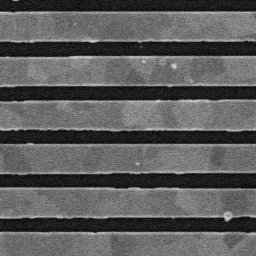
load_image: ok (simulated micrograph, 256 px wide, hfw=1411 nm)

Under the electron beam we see lines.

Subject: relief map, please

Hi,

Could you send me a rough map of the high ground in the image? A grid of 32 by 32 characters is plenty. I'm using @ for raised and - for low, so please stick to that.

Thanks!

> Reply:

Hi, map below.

--------------------------------
--------------------------------
@@@@@@@@@@@@@@@@@@@@@@@@@@@@@@@@
@@@@@@@@@@@@@@@@@@@@@@@@@@@@@@@@
@@@@@@@@@@@@@@@@@@@@@@@@@@@@@@@@
--------------------------------
--------------------------------
@@@@@@@@@@@@@@@@@@@@@@@@@@@@@@@@
@@@@@@@@@@@@@@@@@@@@@@@@@@@@@@@@
@@@@@@@@@@@@@@@@@@@@@@@@@@@@@@@@
@@@@@@@@@@@@@@@@@@@@@@@@@@@@@@@@
--------------------------------
--------------------------------
@@@@@@@@@@@@@@@@@@@@@@@@@@@@@@@@
@@@@@@@@@@@@@@@@@@@@@@@@@@@@@@@@
@@@@@@@@@@@@@@@@@@@@@@@@@@@@@@@@
--------------------------------
--------------------------------
@@@@@@@@@@@@@@@@@@@@@@@@@@@@@@@@
@@@@@@@@@@@@@@@@@@@@@@@@@@@@@@@@
@@@@@@@@@@@@@@@@@@@@@@@@@@@@@@@@
@@@@@@@@@@@@@@@@@@@@@@@@@@@@@@@@
--------------------------------
--------------------------------
@@@@@@@@@@@@@@@@@@@@@@@@@@@@@@@@
@@@@@@@@@@@@@@@@@@@@@@@@@@@@@@@@
@@@@@@@@@@@@@@@@@@@@@@@@@@@@@@@@
--------------------------------
--------------------------------
@@@@@@@@@@@@@@@@@@@@@@@@@@@@@@@@
@@@@@@@@@@@@@@@@@@@@@@@@@@@@@@@@
@@@@@@@@@@@@@@@@@@@@@@@@@@@@@@@@